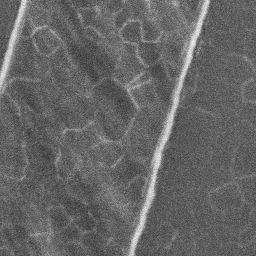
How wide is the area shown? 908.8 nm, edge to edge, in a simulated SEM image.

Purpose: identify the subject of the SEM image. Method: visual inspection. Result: one or a few lines or trenches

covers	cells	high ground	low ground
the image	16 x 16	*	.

.************...
.************...
.***********....
.***********....
************....
***********.....
***********.....
***********.....
**********......
**********......
**********......
**********......
*********.......
*********.......
*********.......
********........